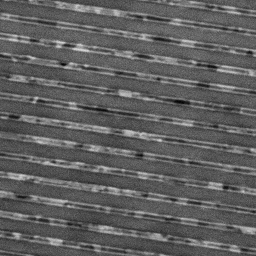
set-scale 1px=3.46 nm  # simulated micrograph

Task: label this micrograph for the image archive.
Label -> parallel lines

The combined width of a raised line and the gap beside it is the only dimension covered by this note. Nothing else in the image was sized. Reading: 67.9 nm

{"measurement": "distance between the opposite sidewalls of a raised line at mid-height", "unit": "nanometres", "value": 18.8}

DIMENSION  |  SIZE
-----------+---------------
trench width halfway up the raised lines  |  50.2 nanometers